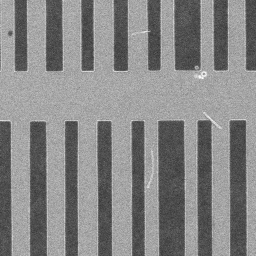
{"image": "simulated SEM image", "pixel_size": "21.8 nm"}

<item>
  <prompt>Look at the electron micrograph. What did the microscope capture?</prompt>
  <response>groups of lines, slits or small figures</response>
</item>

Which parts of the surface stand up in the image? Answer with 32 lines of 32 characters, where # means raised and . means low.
..#...##..##..##..##..###..##..#
..#...##..##..##..##..###..##..#
..#...##..##..##..##..###..##..#
..#...##..##..##..##..###..##..#
..#...##..##..##..##..###..##..#
..#...##..##..##..##..###..##..#
..#...##..##..##..##..###..##..#
..#...##..##..##..##..###..##..#
..#...##..##..##..##..###..##..#
................................
................................
................................
................................
................................
................................
#...##..##..##..##..###..##..##.
#...##..##..##..##..###..##..##.
#...##..##..##..##..###..##..##.
#...##..##..##..##..###..##..##.
#...##..##..##..##.####..##..##.
#...##..##..##..##.####..##..##.
#...##..##..##..##.####..##..##.
#...##..##..##..##..###..##..##.
#...##..##..##..##..###..##..##.
#...##..##..##..##..###..##..##.
#...##..##..##..##..###..##..##.
#...##..##..##..##..###..##..##.
#...##..##..##..##..###..##..##.
##..##..##..##..##..###..##..##.
##..##..##..##..##..###..##..##.
##..##..##..##..##..###..##..##.
##..##..##..##..##..###..##..##.